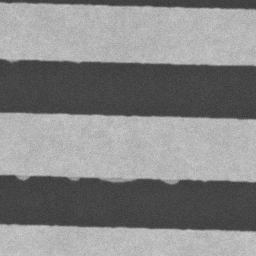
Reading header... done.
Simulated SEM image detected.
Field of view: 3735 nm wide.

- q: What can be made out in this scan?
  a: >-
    lines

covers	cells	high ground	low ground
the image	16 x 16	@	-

@@@@@@@@@@@@----
@@@@@@@@@@@@@@@@
@@@@@@@@@@@@@@@@
@@@@@@@@@@@@@@@@
----------------
----------------
----------------
@@@@@@@@@@@@@@@-
@@@@@@@@@@@@@@@@
@@@@@@@@@@@@@@@@
@@@@@@@@@@@@@@@@
----------------
----------------
----------------
@@@@@@@@@@@@@@@@
@@@@@@@@@@@@@@@@